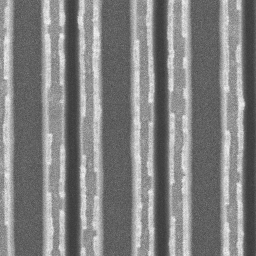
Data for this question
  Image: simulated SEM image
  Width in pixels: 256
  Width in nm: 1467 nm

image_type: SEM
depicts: parallel lines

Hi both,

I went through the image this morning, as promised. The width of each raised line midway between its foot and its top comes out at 0.12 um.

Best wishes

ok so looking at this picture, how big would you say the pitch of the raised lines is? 255 nm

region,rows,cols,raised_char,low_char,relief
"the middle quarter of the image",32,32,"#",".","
....#####.........####....#####.
....#####.........#####...#####.
....#####.........#####...#####.
....#####........######...#####.
....#####........######...#####.
....#####........######...#####.
....#####........######...#####.
....#####........######...#####.
....#####........######...#####.
....#####........######...#####.
....#####........######...#####.
....#####........######...#####.
....#####.........#####...#####.
....#####.........#####...#####.
....#####.........#####...#####.
....#####.........#####...#####.
....#####.........####....#####.
....#####........#####....#####.
....#####........#####....#####.
....#####........#####....#####.
....#####........#####....#####.
....#####........#####....#####.
#...#####........#####....#####.
#...#####.........####....#####.
....#####.........####....#####.
....#####.........####....#####.
....#####.........#####...#####.
....#####.........#####...#####.
....#####.........#####...#####.
....#####.........#####...#####.
....#####.........#####...#####.
....#####.........#####...#####.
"